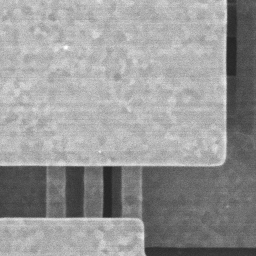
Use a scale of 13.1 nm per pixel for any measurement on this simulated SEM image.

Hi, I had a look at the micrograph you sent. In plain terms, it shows wiring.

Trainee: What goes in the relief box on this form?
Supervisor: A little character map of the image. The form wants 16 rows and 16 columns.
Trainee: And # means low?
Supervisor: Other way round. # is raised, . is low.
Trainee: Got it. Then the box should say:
##############..
##############..
##############..
##############..
##############..
##############..
##############..
##############..
##############..
##############..
................
................
................
................
#########.......
#########.......